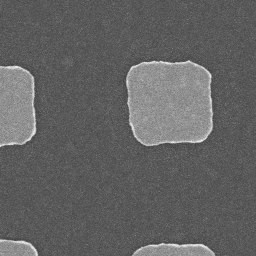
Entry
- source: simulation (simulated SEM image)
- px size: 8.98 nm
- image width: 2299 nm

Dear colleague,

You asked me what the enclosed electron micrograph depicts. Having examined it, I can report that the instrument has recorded raised bodies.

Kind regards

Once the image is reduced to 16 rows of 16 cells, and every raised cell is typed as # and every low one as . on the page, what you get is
................
................
................
................
##......#####...
##......#####...
##......#####...
##......#####...
##.......####...
................
................
................
................
................
................
##.......####...